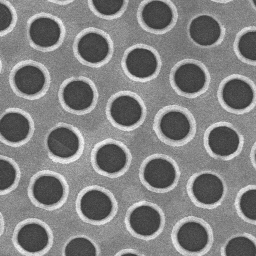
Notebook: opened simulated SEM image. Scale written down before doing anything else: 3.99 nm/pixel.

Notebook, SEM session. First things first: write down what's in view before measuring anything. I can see a regular array of holes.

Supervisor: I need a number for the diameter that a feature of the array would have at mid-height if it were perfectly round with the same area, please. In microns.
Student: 0.127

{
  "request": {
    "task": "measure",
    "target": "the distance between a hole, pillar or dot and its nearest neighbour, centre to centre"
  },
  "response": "0.198 µm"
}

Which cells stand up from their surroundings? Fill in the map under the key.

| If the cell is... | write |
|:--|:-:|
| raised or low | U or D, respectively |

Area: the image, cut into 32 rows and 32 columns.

DUUUUUUUUUUUDDDUUUDDDUUUUUUUUUUU
DUUUUUUUUUUUDDDUUUDDDDUUUUUUUUUU
DDUUDDDUUUUUUUUUUUDDDDUUDDDUUUUU
DUUUDDDDUUUUUUUUUUUDDUUUDDDDUUUU
UUUUDDDDUUDDDUUUUUUUUUUUDDDDUUDD
UUUUDDDUUUDDDDUUUUUUUUUUUDDUUUDD
UUUUUUUUUUDDDDUUDDDUUUUUUUUUUUDD
UUUUUUUUUUDDDUUUDDDDUUUUUUUUUUUD
UUDDDUUUUUUUUUUUDDDDUUDDDUUUUUUU
UUDDDDUUUUUUUUUUUDDUUUDDDDUUUUUU
UUDDDDUUDDDUUUUUUUUUUUDDDDUUDDDU
UUDDDUUUDDDDUUUUUUUUUUUDDUUUDDDD
UUUUUUUUDDDDUUDDDUUUUUUUUUUUDDDD
UUUUUUUUUDDUUUDDDDUUUUUUUUUUUDDU
DDDUUUUUUUUUUUDDDDUUDDDUUUUUUUUU
DDDDUUUUUUUUUUUDDUUUDDDDUUUUUUUU
DDDDUUDDDUUUUUUUUUUUDDDDUUDDDDUU
UDDUUUDDDDUUUUUUUUUUUDDUUUDDDDUU
UUUUUUDDDDUUDDDUUUUUUUUUUUDDDDUU
UUUUUUUDDUUUDDDDUUUUUUUUUUUDUUUU
DUUUUUUUUUUUDDDDUUDDDUUUUUUUUUUU
DDUUUUUUUUUUUDDUUUDDDDUUUUUUUUUU
DDUUDDDDUUUUUUUUUUDDDDUUDDDDUUUU
DUUUDDDDUUUUUUUUUUUDDUUUDDDDUUUU
UUUUDDDDUUDDDDUUUUUUUUUUDDDDUUDD
UUUUUDDUUUDDDDUUUUUUUUUUUDDUUUDD
UUUUUUUUUUDDDDUUDDDDUUUUUUUUUUDD
UUUUUUUUUUUDDUUUDDDDUUUUUUUUUUUD
UUUDDDUUUUUUUUUUDDDDUUDDDDUUUUUU
UUDDDDUUUUUUUUUUUUDUUUDDDDUUUUUU
UUDDDDUUDDDDUUUUUUUUUUDDDDUUDDDD
UUUDDUUUDDDDUUUUUUUUUUUUDUUUDDDD